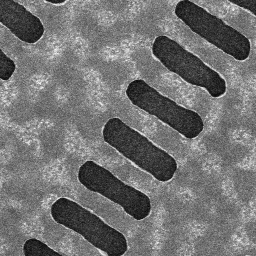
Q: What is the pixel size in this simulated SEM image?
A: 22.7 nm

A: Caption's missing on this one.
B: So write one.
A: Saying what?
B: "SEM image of holes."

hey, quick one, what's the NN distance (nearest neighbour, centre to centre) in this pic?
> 1080 nm